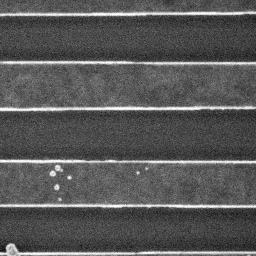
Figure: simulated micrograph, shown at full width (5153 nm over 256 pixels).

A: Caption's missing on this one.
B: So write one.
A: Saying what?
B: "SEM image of lines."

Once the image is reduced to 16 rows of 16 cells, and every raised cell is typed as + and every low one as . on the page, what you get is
++++++++++++++++
................
................
................
++++++++++++++++
++++++++++++++++
++++++++++++++++
................
................
................
++++++++++++++++
++++++++++++++++
++++++++++++++++
................
................
................